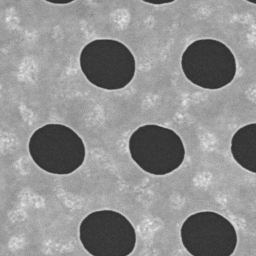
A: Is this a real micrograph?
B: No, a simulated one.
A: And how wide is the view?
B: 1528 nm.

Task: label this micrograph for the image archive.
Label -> holes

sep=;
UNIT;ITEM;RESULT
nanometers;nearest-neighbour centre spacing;590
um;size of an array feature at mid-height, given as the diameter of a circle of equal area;0.313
